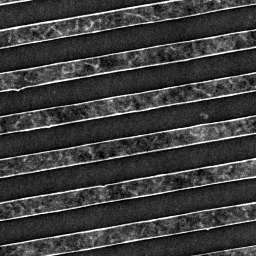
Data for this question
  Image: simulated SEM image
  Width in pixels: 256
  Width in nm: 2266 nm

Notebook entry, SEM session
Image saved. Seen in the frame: parallel lines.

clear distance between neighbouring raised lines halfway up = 221 nm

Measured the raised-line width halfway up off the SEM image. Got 159 nm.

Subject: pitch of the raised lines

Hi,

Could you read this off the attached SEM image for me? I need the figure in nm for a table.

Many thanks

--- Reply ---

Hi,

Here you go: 376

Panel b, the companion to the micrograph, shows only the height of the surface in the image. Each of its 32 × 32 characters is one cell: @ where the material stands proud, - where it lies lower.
@------------------@@@@@@@@@@@@@
-------------@@@@@@@@@@@@@------
--------@@@@@@@@@@@@@-----------
--@@@@@@@@@@@@@-----------------
@@@@@@@@@------------------@@@@@
@@@------------------@@@@@@@@@@@
---------------@@@@@@@@@@@@@----
----------@@@@@@@@@@@@@---------
----@@@@@@@@@@@@@---------------
@@@@@@@@@@@-------------------@@
@@@@@@------------------@@@@@@@@
------------------@@@@@@@@@@@@@-
------------@@@@@@@@@@@@@-------
------@@@@@@@@@@@@@-------------
@@@@@@@@@@@@@@-----------------@
@@@@@@@@------------------@@@@@@
@@------------------@@@@@@@@@@@@
--------------@@@@@@@@@@@@@-----
---------@@@@@@@@@@@@-----------
--@@@@@@@@@@@@@@----------------
@@@@@@@@@@------------------@@@@
@@@@------------------@@@@@@@@@@
-----------------@@@@@@@@@@@@@--
-----------@@@@@@@@@@@@@--------
-----@@@@@@@@@@@@@--------------
@@@@@@@@@@@@-------------------@
@@@@@@@-----------------@@@@@@@@
@------------------@@@@@@@@@@@@@
-------------@@@@@@@@@@@@@@-----
--------@@@@@@@@@@@@@-----------
--@@@@@@@@@@@@@-----------------
@@@@@@@@@------------------@@@@@